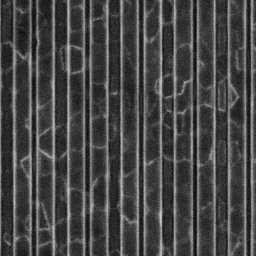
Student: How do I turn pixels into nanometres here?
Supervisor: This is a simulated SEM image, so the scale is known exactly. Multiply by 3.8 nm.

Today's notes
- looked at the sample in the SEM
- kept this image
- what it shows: parallel lines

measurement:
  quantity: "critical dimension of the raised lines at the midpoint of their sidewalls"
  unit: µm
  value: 0.0661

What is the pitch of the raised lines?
102 nanometres